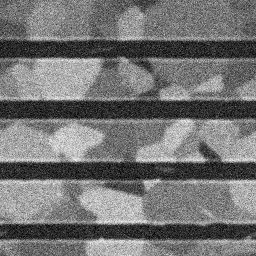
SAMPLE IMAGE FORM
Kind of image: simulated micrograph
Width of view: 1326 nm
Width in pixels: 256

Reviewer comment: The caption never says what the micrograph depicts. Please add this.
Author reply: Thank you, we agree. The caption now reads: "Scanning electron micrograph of one or a few lines or trenches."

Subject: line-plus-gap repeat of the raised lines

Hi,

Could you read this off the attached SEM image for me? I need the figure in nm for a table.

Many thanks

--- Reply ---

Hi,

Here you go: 318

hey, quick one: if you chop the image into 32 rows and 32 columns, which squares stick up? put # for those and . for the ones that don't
################################
################################
################################
################################
################################
................................
................................
.##...........######............
################################
################################
################################
################################
................................
................................
................................
################################
################################
################################
################################
################################
................................
................................
................................
################################
################################
################################
################################
################################
................................
................................
################################
################################